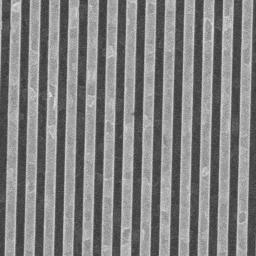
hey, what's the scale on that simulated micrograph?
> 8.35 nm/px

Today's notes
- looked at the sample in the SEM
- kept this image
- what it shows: parallel lines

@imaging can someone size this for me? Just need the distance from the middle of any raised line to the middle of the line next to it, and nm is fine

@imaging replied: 161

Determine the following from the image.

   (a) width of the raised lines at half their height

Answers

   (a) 9.75 pixels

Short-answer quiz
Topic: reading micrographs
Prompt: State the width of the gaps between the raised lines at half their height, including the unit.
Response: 0.0762 um